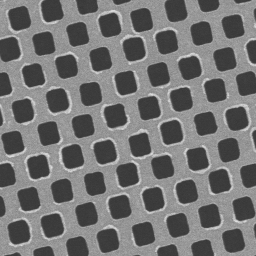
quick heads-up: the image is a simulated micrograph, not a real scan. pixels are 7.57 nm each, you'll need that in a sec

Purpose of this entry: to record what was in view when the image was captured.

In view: a regular array of holes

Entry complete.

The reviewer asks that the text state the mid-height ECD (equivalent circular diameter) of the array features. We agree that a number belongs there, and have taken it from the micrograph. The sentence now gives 0.178 um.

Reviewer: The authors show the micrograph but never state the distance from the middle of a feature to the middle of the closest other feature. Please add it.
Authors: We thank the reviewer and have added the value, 251 nm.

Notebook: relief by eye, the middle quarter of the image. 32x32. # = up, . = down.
...####.....#########.....###...
...####...###########.....###...
...##########....####.....###...
.############.....###......###..
#######.#####.....####....######
####.....####.....####..########
####.....####.....#########....#
.###.....#####..###########.....
.###.....##########....####.....
.###.....#########.....####.....
.##########....###......###.....
##########.....####.....####..##
##########.....####.....########
##.....###......###....#########
##.....####.....#########....###
##......###...##########.....###
##......################.....###
###....############..###......##
####.###########.....####.....##
########....####.....####....###
#...###......###......##########
....###......####.....#########.
.....###.....####....##########.
.....###.....#########.....####.
.....###....##########.....####.
....##########....####.....####.
#############.....####.....#####
######....###.....#####....#####
#####.....####.....####...######
..###.....####....###########...
..###.....####...###########....
..####....##########....####....